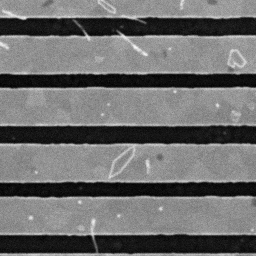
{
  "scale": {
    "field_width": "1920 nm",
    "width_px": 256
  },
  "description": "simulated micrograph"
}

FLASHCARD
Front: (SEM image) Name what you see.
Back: lines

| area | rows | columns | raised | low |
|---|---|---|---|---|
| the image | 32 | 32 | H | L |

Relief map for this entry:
HHHHHHHHHHHHHHHHHHHHHHHHHHHHHHHH
HHHHHHHHHHHHHHHHHHHHHHHHHHHHHHHH
LLLLLLLLLLLLLLLLLLLLLLLLLLLLLLLL
LLLLLLLLLLLLLLLLLLLLLLLLLLLLLLLL
LLLLLLLLLLHLLLLHLLLLLLLLLLLLLLLL
HHHHHHHHHHHHHHHHHHHHHHHHHHHHHHHH
HHHHHHHHHHHHHHHHHHHHHHHHHHHHHHHH
HHHHHHHHHHHHHHHHHHHHHHHHHHHHHHHH
HHHHHHHHHHHHHHHHHHHHHHHHHHHHHHHH
LLLLLLLLLLLLLLLLLLLLLLLLLLLLLLLL
LLLLLLLLLLLLLLLLLLLLLLLLLLLLLLLL
HHHHHHHHHHHHHHHHHHHHHHHHHHHHHHHH
HHHHHHHHHHHHHHHHHHHHHHHHHHHHHHHH
HHHHHHHHHHHHHHHHHHHHHHHHHHHHHHHH
HHHHHHHHHHHHHHHHHHHHHHHHHHHHHHHH
HHHHHHHHHHHHHHHHHHHHHHHHHHHHHHHH
LLLLLLLLLLLLLLLLLLLLLLLLLLLLLLLL
LLLLLLLLLLLLLLLLLLLLLLLLLLLLLLLL
HHHHHHHHHHHHHHHHHHHHHHHHHHHHHHHH
HHHHHHHHHHHHHHHHHHHHHHHHHHHHHHHH
HHHHHHHHHHHHHHHHHHHHHHHHHHHHHHHH
HHHHHHHHHHHHHHHHHHHHHHHHHHHHHHHH
HHHHHHHHHHHHHHHHHHHHHHHHHHHHHHHH
LLLLLLLLLLLLLLLLLLLLLLLLLLLLLLLL
LLLLLLLLLLLLLLLLLLLLLLLLLLLLLLLL
HHHHHHHHHHHHHHHHHHHHHHHHHHHHHHHH
HHHHHHHHHHHHHHHHHHHHHHHHHHHHHHHH
HHHHHHHHHHHHHHHHHHHHHHHHHHHHHHHH
HHHHHHHHHHHHHHHHHHHHHHHHHHHHHHHH
LLLLLLLLLLLLLLLLLLLLLLLLLLLLLLLL
LLLLLLLLLLLLLLLLLLLLLLLLLLLLLLLL
LLLLLLLLLLLLLLLLLLLLLLLLLLLLLLLL